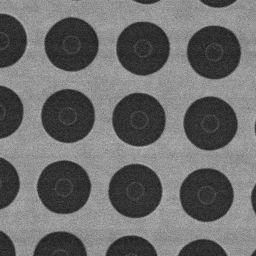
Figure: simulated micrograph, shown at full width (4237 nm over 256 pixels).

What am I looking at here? an array of small figures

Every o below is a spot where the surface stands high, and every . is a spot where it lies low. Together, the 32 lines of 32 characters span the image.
oooooooooooooooooo.oooooo....ooo
oooooooooooooooooooooooooooooooo
..oooooo..oooooooooooooooooooooo
...ooo......oooo....ooooo...oooo
o..ooo......ooo......ooo.....ooo
o..oo...oo..ooo..oo..oo.......oo
...ooo......oo...oo..oo...oo..oo
..oooo......ooo......ooo..o...oo
ooooooo....oooo.....oooo......oo
ooooooooooooooooooooooooo...oooo
oooooooooooooooooooooooooooooooo
..ooooo...oooooooooooooooooooooo
...ooo.....oooo.....ooooo...oooo
...oo.......oo......oooo.....ooo
...oo..ooo..oo..oo...oo...o...oo
...oo.......oo...o...oo..oo...oo
..oooo.....ooo......ooo.......oo
ooooooo...ooooo.....oooo.....ooo
ooooooooooooooooooooooooo...oooo
oooooooooooooooooooooooooooooooo
.ooooo....oooooo..oooooooooooooo
..ooo......oooo....ooooo....oooo
..ooo......ooo......ooo......ooo
..ooo..oo..ooo..oo..oo...o...ooo
..ooo......ooo..oo..oo...oo..oo.
.oooo......ooo......ooo......oo.
ooooooo..oooooo....oooo.....oooo
ooooooooooooooooooooooooo..ooooo
oooooooooooooooooooooooooooooooo
.ooooo....oooooo.ooooooooooooooo
..ooo.....oooo.....oooo....ooooo
..oo...o...oo.......oo......oooo